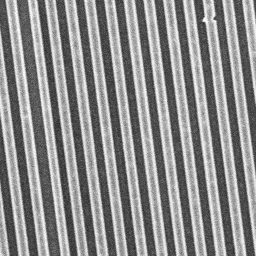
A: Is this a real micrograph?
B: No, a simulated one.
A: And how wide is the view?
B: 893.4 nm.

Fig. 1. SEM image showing parallel lines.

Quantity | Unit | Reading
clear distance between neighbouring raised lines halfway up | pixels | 10.1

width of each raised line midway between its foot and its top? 32.4 nm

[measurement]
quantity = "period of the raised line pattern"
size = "68.2 nm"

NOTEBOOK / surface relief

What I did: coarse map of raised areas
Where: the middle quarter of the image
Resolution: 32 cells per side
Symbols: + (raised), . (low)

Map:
...++..+++..+++..+++..++...++...
...++...++...++..+++..+++..++...
...++...++...++...++..+++..+++..
...++...++...++...++...++...++..
...++...++...++...++...++...++..
...++...++...++...++...++...++..
+..+++..++...++...++...++...++..
+..+++..+++..++...++...++...++..
+..+++...++..+++..+++..++...++..
+...++...++...++..+++..+++..++..
+...++...++...++...++...++..+++.
+...++...++...++...++...++...++.
+...++...++...++...++...++...++.
++..++...++...++...++...++...++.
++..+++..++...++...++...++...++.
++...++..+++..+++..++...++...++.
++...++...++..+++..+++..++...+++
++...++...++...++...++..+++..+++
++...++...++...++...++...++..+++
++...++...++...++...++...++...++
++...++...++...++...++...++...++
+++..++...++...++...++...++...++
+++..+++..+++..++...++...++...++
.++..+++..+++..+++..++...++...++
.++..+++...++..+++..+++..+++..++
.++...++...++...++...++..+++..++
.++...++...++...++...++...++..++
.++...++...++...++...++...++...+
.++...++...++...++...++...++...+
.+++..+++..++...++...++...++...+
..++..+++..+++..++...++...++...+
..++...++..+++..+++..+++..++...+